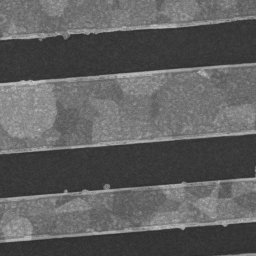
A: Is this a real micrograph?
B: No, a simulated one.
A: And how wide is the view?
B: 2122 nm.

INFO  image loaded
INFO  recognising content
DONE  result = one or a few lines or trenches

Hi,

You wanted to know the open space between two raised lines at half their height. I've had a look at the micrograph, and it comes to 372 nm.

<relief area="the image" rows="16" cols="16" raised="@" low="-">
@@@@@@@@@@@@@@@@
@@@@@@@@@@@@@---
----------------
----------------
----------@@@@@@
@@@@@@@@@@@@@@@@
@@@@@@@@@@@@@@@@
@@@@@@@@@@@@@@@@
@@@@@@@@@@@@@---
@---------------
----------------
-----------@@@@@
@@@@@@@@@@@@@@@@
@@@@@@@@@@@@@@@@
@@@@@@@---------
----------------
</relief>